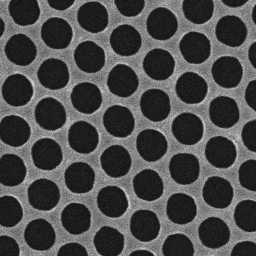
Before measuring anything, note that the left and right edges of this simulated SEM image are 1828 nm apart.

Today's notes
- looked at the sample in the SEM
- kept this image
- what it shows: a regular array of holes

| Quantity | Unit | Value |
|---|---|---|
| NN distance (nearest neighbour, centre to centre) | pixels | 39.7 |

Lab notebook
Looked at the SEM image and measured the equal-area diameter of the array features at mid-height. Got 0.226 um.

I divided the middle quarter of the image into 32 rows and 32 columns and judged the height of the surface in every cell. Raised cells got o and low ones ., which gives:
.oo.......ooo...oooo........oooo
.ooo.....ooo.....ooo.......ooooo
.oooooooooo.......ooo......ooo..
.oooooooooo.......oooo....ooo...
.oooo.ooooo........ooooooooo....
ooo.....ooo........ooooooooo....
oo.......oo.......ooo...oooo....
oo.......ooo.....ooo......oo....
oo.......oooooooooo.......ooo...
oo.......oooooooooo.......oooo..
oo.......ooo..ooooo........ooooo
ooo.....ooo.....ooo........ooooo
oooooo.ooo.......ooo......ooo...
.ooooooooo........ooo.....oo....
ooo..ooooo........ooooooooo.....
oo.....ooo........ooooooooo.....
o.......ooo......ooo...oooo.....
o........ooo.....oo......oo.....
o........ooooooooo.......ooo....
o........ooooooooo........ooo...
o.......oooo..oooo........oooooo
ooo.....oo......oo........oooooo
ooooooooo.......ooo......ooo...o
ooooooooo........ooo....ooo.....
ooo..oooo........oooo.oooo......
o......oo........ooooooooo......
o......ooo......oooo..oooo......
........ooo.....oo......ooo.....
........ooooooooo.......ooo.....
........ooooooooo........ooo....
o......oooo..oooo........ooooooo
o......oo......ooo.......ooooooo